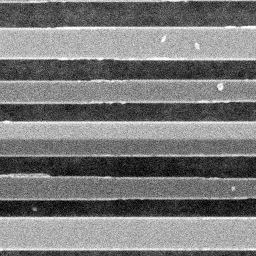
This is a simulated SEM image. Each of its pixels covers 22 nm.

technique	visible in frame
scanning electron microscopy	lines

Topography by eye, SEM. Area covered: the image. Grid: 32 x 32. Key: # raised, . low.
................................
................................
................................
.......#########################
################################
################################
################################
................................
................................
................................
################################
################################
################################
................................
................................
################################
################################
################################
################################
................................
................................
................................
################################
################################
################################
................................
................................
################################
################################
################################
################################
................................